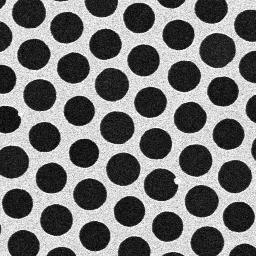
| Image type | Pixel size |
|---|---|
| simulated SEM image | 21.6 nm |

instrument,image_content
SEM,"a regular array of holes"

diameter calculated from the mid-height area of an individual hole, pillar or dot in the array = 693 nanometres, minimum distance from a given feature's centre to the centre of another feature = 0.891 µm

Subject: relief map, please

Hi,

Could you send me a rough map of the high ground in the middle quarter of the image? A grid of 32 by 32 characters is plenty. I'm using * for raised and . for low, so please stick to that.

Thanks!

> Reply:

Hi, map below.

......**********........***.....
......****....***......***......
......***......***....****......
......**........**********......
*...****........**********......
********........***********.....
********........***.....****....
********........**.......*******
**....***......***........******
*......***********........*****.
........**********........***...
........**********.......***....
........***.....***.....****....
.......***.......**********.....
*......**........**********.....
***.*****.........**********....
*********.........***....****...
*********........***......******
**********.......**........*****
***....****.....***........*****
**......***********........****.
*........**********........***..
*........****....***......***...
*.......****......***....****...
**......***........**********...
***....****........**********...
**********.........***....***...
.**********........**......****.
.**********.......**........****
.***.....***......**........****
***.......****.*****.........***
**.........*********........***.